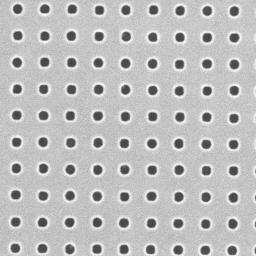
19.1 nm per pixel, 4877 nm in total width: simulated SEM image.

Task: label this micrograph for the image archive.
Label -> a regular array of holes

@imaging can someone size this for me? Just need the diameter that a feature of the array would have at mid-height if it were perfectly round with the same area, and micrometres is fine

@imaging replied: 0.204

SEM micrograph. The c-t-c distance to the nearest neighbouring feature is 500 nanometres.